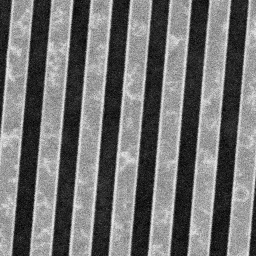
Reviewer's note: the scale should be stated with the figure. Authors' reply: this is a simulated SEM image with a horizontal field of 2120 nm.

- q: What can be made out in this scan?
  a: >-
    parallel lines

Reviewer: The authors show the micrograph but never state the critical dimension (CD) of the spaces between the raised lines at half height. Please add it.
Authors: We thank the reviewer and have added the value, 158 nm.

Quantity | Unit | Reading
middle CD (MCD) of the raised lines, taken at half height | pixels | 20.4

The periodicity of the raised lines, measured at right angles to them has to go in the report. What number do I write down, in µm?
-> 0.326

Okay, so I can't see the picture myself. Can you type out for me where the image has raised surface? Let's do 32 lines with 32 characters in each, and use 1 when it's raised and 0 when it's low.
00110001100111001110011100111001
01110011100111001110011100111001
01110011100111001110011100111001
01110011100111001110011100110001
01110011100111001110011000110001
01110011100110001100011000110001
01110011100110001100011000110001
01100011000110001100011000110001
01100011000110001100011000110001
01100011000110001100011001110011
01100011000110001100111001110011
01100011001110011100111001110011
11100011001110011100111001110011
11100111001110011100111001110011
11100111001110011100111001110011
11100111001110011100111001100011
11100111001110011100110001100011
11100111001100011000110001100011
11000110001100011000110001100011
11000110001100011000110001100011
11000110001100011000110011100111
11000110001100011000110011100111
11000110001100011001110011100111
11000110011100111001110011100111
11001110011100111001110011100111
11001110011100111001110011100111
11001110011100111001110011000110
11001110011100111001110011000110
11001110011100111001100011000110
11001110011000110001100011000110
10001100011000110001100011000110
10001100011000110001100011000110